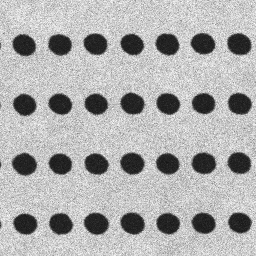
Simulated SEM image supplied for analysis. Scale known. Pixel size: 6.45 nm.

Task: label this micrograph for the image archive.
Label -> a regular array of holes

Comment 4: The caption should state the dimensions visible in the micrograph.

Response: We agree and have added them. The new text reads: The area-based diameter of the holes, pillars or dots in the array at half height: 144 nm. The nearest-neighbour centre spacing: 229 nm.